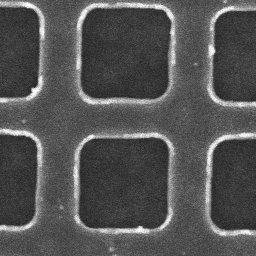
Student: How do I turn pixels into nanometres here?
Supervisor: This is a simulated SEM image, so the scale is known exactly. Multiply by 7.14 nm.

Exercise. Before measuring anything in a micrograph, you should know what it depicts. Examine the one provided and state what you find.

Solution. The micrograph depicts holes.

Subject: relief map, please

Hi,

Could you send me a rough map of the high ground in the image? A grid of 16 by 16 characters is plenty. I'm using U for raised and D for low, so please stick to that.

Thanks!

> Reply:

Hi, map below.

DDUUUUDDDUUUUUUU
DDUUUDDDDDDUUDDD
DDDUUDDDDDDUUDDD
DDDUUDDDDDDUUDDD
DDUUUDDDDDDUUDDD
DDUUUDDDDDUUUDDD
UUUUUUUUUUUUUUUU
UUUUUUUUUUUUUUUU
DUUUUUUUUUUUUUUU
DDUUUDDDDDDUUDDD
DDUUUDDDDDDUUDDD
DDUUUDDDDDDUUDDD
DDUUUDDDDDDUUDDD
DDUUUDDDDDUUUDDD
UUUUUUUUUUUUUUUU
UUUUUUUUUUUUUUUU